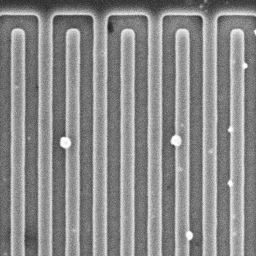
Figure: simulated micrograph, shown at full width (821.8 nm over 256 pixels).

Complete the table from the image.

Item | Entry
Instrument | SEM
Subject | groups of lines, slits or small figures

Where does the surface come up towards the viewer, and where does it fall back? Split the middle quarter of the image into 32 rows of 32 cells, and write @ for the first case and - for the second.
-@@@----@@@---@@@@---@@@----@@@-
-@@@----@@@---@@@@---@@@----@@@-
-@@@----@@@---@@@@---@@@----@@@-
-@@@----@@@---@@@@---@@@----@@@-
-@@@----@@@---@@@@---@@@----@@@-
-@@@----@@@---@@@@---@@@----@@@-
-@@@----@@@---@@@@---@@@----@@@-
-@@@----@@@---@@@@---@@@----@@@-
-@@@----@@@---@@@@---@@@----@@@-
-@@@----@@@---@@@@---@@@----@@@-
-@@@----@@@---@@@@---@@@----@@@-
-@@@----@@@---@@@@---@@@----@@@-
-@@@----@@@---@@@@---@@@----@@@-
-@@@----@@@---@@@----@@@----@@@-
-@@@----@@@---@@@----@@@----@@@-
-@@@----@@@---@@@@---@@@----@@@-
-@@@----@@@---@@@@---@@@----@@@-
-@@@----@@@---@@@@---@@@----@@@-
@@@@----@@@---@@@@---@@@---@@@@-
@@@@----@@@---@@@@---@@@---@@@@-
@@@@----@@@---@@@@---@@@----@@@-
-@@@----@@@---@@@@---@@@----@@@-
-@@@----@@@---@@@@---@@@----@@@-
-@@@----@@@---@@@@---@@@----@@@-
-@@@----@@@---@@@@---@@@----@@@-
-@@@----@@@---@@@@---@@@----@@@-
-@@@----@@@---@@@----@@@----@@@-
-@@@----@@@---@@@----@@@----@@@-
-@@@----@@@---@@@----@@@----@@@-
-@@@----@@@---@@@----@@@----@@@-
-@@@----@@@---@@@----@@@----@@@-
-@@@----@@@---@@@----@@@----@@@-